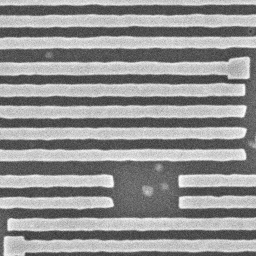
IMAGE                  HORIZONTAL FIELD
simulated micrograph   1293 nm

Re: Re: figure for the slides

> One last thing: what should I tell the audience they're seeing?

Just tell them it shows wiring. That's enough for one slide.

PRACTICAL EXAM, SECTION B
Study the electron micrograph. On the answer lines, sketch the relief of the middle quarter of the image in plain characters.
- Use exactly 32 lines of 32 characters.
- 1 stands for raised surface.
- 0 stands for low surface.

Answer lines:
11111111111111111111111111111111
11111111111111111111111111111111
11111110000000000000000000000111
00000000000000000000000000000000
00000000000000000000000000000000
11111111111111111111111111111111
11111111111111111111111111111111
11111111111111111111111111111111
00000000000000000000000000000000
00000000000000000000000000000000
00000000000111001110111111110011
11111111111111111111111111111111
11111111111111111111111111111111
00000000000000000000000000000000
00000000000000000000000000000000
00000000000000000000000000000000
11111111111111111111111111111111
11111111111111111111111111111111
11111100111111011110000011110000
00000000000000000000000000000000
00000000000000000000000000000000
00000011100000000111111111111100
11111111111111111111111111111111
11111111111111111111111111111111
00000000000000000000000000000000
00000000000000000000000000000000
00000000000000000000000000000000
00000000000000000000000000000000
11111111111100000000000000000111
11111111111100000000000000000111
00110010011100000000000000000111
00000000000000000000000000000000